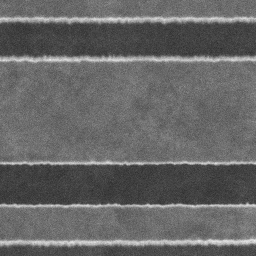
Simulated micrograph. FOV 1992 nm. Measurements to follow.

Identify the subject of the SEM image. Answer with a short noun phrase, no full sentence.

lines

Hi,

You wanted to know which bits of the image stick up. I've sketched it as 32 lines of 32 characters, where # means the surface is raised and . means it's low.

################################
################################
................................
................................
................................
................................
................................
####.###########################
################################
################################
################################
################################
################################
################################
################################
################################
################################
################################
################################
################################
................................
................................
................................
................................
................................
................................
################################
################################
################################
################################
................................
................................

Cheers